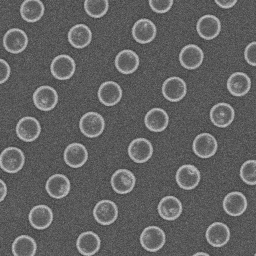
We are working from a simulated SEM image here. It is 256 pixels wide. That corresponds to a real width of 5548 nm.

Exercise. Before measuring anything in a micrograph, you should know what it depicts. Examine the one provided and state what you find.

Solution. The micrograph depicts a regular array of raised bodies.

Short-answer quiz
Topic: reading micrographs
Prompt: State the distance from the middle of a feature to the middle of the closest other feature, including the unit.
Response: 762 nanometres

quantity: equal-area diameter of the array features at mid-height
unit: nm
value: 502